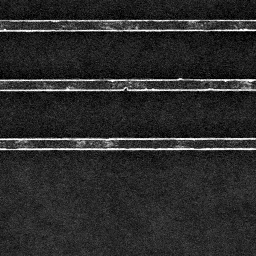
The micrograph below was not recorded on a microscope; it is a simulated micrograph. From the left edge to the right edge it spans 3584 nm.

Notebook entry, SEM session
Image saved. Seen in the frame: parallel lines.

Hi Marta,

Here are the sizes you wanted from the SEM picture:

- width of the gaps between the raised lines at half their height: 679 nanometers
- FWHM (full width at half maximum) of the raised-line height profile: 145 nanometres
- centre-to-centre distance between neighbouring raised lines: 0.83 microns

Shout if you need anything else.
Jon